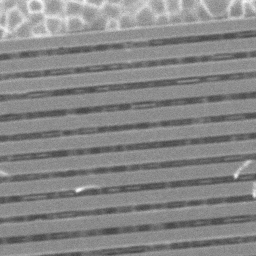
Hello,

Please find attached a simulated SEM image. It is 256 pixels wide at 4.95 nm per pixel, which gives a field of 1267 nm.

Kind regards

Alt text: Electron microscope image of parallel lines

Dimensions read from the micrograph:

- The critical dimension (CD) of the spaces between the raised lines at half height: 0.0363 µm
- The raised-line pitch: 101 nanometers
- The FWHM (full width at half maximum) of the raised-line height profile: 62.8 nm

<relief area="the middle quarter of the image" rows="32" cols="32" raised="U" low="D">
UUUUUDDDDDDDDDDDDDDDDDDDDDDUUUUU
DDDDDDDDDDDDDDDDUUUUUUUUUUUUUUUU
DDDDDUUUUUUUUUUUUUUUUUUUUUUUUUUU
UUUUUUUUUUUUUUUUUUUUUUUUUUUDDDDD
UUUUUUUUUUUUUUUUDDDDDDDDDDDDDDDD
UUUUUDDDDDDDDDDDDDDDDDDDDDDUUUUU
DDDDDDDDDDDDDDDDUUUUUUUUUUUUUUUU
DDDDDUUUUUUUUUUUUUUUUUUUUUUUUUUU
UUUUUUUUUUUUUUUUUUUUUUUUUUUUUUDD
UUUUUUUUUUUUUUUUUUUDDDDDDDDDDDDD
UUUUUUUUDDDDDDDDDDDDDDDDDDDDDDUU
DDDDDDDDDDDDDDDDDDDUUUUUUUUUUUUU
DDDDDDDDUUUUUUUUUUUUUUUUUUUUUUUU
UUUUUUUUUUUUUUUUUUUUUUUUUUUUUUDD
UUUUUUUUUUUUUUUUUUUDDDDDDDDDDDDD
UUUUUUUUDDDDDDDDDDDDDDDDDDDDDDUU
DDDDDDDDDDDDDDDDDDDUUUUUUUUUUUUU
DDDDDDDDUUUUUUUUUUUUUUUUUUUUUUUU
UUUUUUUUUUUUUUUUUUUUUUUUUUUUUUDD
UUUUUUUUUUUUUUUUUUUDDDDDDDDDDDDD
UUUUUUUUDDDDDDDDDDDDDDDDDDDDDDDD
DDDDDDDDDDDDDDDDDDDDDDUUUUUUUUUU
DDDDDDDDDDDUUUUUUUUUUUUUUUUUUUUU
UUUUUUUUUUUUUUUUUUUUUUUUUUUUUUUU
UUUUUUUUUUUUUUUUUUUUUUDDDDDDDDDD
UUUUUUUUUUUDDDDDDDDDDDDDDDDDDDDD
UDDDDDDDDDDDDDDDDDDDDDUUUUUUUUUU
DDDDDDDDDDDUUUUUUUUUUUUUUUUUUUUU
UUUUUUUUUUUUUUUUUUUUUUUUUUUUUUUU
UUUUUUUUUUUUUUUUUUUUUUUUDDDDDDDD
UUUUUUUUUUUUDDDDDDDDDDDDDDDDDDDD
DDDUDDDDDDDDDDDDDDDDDDDDUUUUUUUU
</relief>